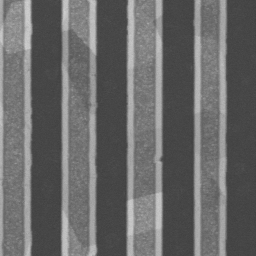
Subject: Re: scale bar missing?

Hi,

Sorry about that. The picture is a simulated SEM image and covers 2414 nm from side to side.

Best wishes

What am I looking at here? one or a few lines or trenches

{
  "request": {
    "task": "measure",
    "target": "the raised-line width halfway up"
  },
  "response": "27.3 pixels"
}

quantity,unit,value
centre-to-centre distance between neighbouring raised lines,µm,0.62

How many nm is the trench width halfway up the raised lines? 358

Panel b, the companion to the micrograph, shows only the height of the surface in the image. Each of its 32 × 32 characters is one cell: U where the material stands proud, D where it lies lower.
UUUDDDDDUUUUDDDDUUUUDDDDDUUUDDDD
UUUDDDDDUUUUDDDDUUUUDDDDDUUUDDDD
UUUDDDDDUUUUDDDDUUUUDDDDDUUUDDDD
UUUDDDDDUUUUDDDDDUUUDDDDDUUUDDDD
UUUDDDDDUUUUDDDDDUUUDDDDDUUUDDDD
UUUDDDDDUUUUDDDDUUUUDDDDDUUUDDDD
UUUDDDDDUUUUDDDDUUUUDDDDDUUUDDDD
UUUDDDDDUUUUDDDDUUUUDDDDDUUUDDDD
UUUDDDDDUUUUDDDDUUUUDDDDDUUUDDDD
UUUDDDDDUUUUDDDDUUUUDDDDDUUUDDDD
UUUDDDDDUUUUDDDDUUUUDDDDDUUUDDDD
UUUDDDDDUUUUDDDDUUUUDDDDDUUUDDDD
UUUDDDDDUUUUDDDDUUUUDDDDDUUUDDDD
UUUDDDDDUUUUDDDDUUUUDDDDDUUUDDDD
UUUDDDDDUUUUDDDDUUUUDDDDDUUUDDDD
UUUDDDDDUUUUDDDDUUUUDDDDDUUUDDDD
UUUDDDDDUUUUDDDDUUUUDDDDDUUUDDDD
UUUDDDDDUUUUDDDDUUUUDDDDDUUUDDDD
UUUDDDDDUUUDDDDDUUUUDDDDDUUUDDDD
UUUDDDDDUUUDDDDDUUUUDDDDDUUUDDDD
UUUDDDDDUUUDDDDDUUUUDDDDDUUUDDDD
UUUDDDDDUUUDDDDDUUUUDDDDDUUUDDDD
UUUDDDDDUUUDDDDDUUUUDDDDDUUUDDDD
UUUDDDDDUUUDDDDDUUUUDDDDDUUUDDDD
UUUDDDDDUUUDDDDDUUUUDDDDDUUUDDDD
UUUDDDDDUUUDDDDDUUUUDDDDDUUUDDDD
UUUDDDDDUUUDDDDDUUUUDDDDDUUUDDDD
UUUDDDDDUUUDDDDDUUUUDDDDDUUUDDDD
UUUDDDDDUUUDDDDDUUUUDDDDDUUUDDDD
UUUDDDDDUUUDDDDDUUUUDDDDDUUUDDDD
UUUDDDDDUUUDDDDDUUUUDDDDDUUUDDDD
UUUDDDDDUUUDDDDDUUUUDDDDDUUUDDDD